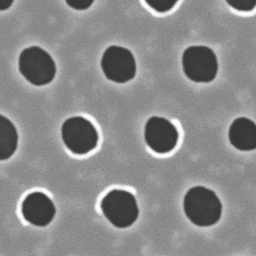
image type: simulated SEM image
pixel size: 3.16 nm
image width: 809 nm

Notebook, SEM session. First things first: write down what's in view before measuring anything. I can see a regular array of holes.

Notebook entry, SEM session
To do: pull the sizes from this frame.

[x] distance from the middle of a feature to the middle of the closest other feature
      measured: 257 nm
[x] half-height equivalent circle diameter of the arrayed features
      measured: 119 nm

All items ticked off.